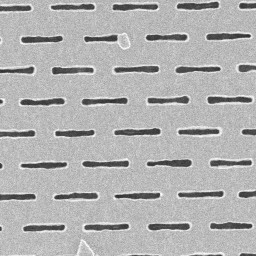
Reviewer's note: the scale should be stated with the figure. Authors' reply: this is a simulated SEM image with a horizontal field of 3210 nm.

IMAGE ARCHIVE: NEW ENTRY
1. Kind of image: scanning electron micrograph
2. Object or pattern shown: a regular array of holes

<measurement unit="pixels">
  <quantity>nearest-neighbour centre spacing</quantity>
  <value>43.2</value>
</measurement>